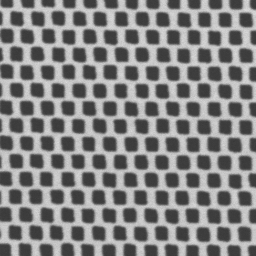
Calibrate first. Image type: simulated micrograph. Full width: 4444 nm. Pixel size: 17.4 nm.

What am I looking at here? a regular array of holes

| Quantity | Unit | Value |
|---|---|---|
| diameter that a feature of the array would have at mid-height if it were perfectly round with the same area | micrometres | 0.27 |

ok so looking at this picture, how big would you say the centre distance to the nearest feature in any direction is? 349 nanometres